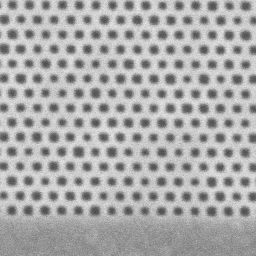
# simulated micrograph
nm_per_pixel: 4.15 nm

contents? a regular array of holes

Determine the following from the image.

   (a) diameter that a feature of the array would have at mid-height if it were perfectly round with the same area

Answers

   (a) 42.4 nanometers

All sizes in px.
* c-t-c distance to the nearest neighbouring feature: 16.5